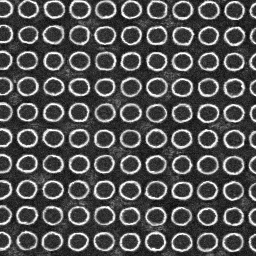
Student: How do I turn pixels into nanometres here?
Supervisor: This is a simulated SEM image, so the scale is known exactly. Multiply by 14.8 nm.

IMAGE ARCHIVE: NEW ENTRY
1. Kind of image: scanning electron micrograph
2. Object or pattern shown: a regular array of raised bodies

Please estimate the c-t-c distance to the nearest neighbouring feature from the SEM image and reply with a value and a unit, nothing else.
0.376 µm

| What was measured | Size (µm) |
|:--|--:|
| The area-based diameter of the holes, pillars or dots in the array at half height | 0.275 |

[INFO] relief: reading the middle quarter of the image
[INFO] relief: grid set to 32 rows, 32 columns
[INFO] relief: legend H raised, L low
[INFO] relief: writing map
LLHHHHLLHHHHLLLHHHHLLHHHHLLLHHHH
LLLLLLLLLLLLLLLLLLLLLLLLLLLLLLLL
LLLLLLLLLLLLLLLLLLLLLLLLLLLLLLLL
LLLLLLLLLLLLLLLLLLLLLLLLLLLLLLLL
LLHHHHLLHHHHLLLHHHHLLHHHHLLLHHHL
LHHHHHLLHHHHLLLHHHHLLHHHHHLHHHHH
LLHHHHLLHHHHLLLHHHHLLHHHHLLHHHHH
LLLHHHLLLHHLLLLHHHLLLLHHLLLLHHHL
LLLLLLLLLLLLLLLLLLLLLLLLLLLLLLLL
LLLLLLLLLLLLLLLLLLLLLLLLLLLLLLLL
LLHHHLLLLHHHLLLLHHLLLLHHLLLLHHHL
LLHHHHLLHHHHHLHHHHHLLHHHHLLHHHHH
LLHHHHLLHHHHHLHHHHHLLHHHHHLHHHHH
LLHHHHLLLHHHLLLHHHHLLHHHHLLLHHHH
LLLLLLLLLLLLLLLLLLLLLLLLLLLLLLLL
LLLLLLLLLLLLLLLLLLLLLLLLLLLLLLLL
LLLLHLLLLLLLLLLLLLLLLLLLLLLLLLLL
LLHHHHLLHHHHLLLHHHHLLHHHHLLHHHHH
LLHHHHLLHHHHLLHHHHHLLHHHHLLHHHHH
LLHHHHLLHHHHLLHHHHHLLHHHHLLHHHHH
LLHHLLLLHHHHLLLLHHLLLLHHLLLLHHLL
LLLLLLLLLLLLLLLLLLLLLLLLLLLLLLLL
LLLLLLLLLLLLLLLLLLLLLLLLLLLLLLLL
LLHHHHLLHHHHLLLHHHLLLLHHLLLLHHHL
LLHHHHLLHHHHLLHHHHHLLHHHHLLHHHHH
LHHHHHLLHHHHLLHHHHHLLHHHHLLHHHHH
LLHHHHLLHHHHLLLHHHLLLHHHHLLLHHHL
LLLLLLLLLLLLLLLLLLLLLLLLLLLLLLLL
LLLLLLLLLLLLLLLLLLLLLLLLLLLLLLLL
LLHHHLLLLHHLLLLLLLLLLLLLLLLLLLLL
LHHHHHLLHHHHLLHHHHHLLHHHHLLLHHHH
LHHHHHLLHHHHLLHHHHHLLHHHHLLHHHHH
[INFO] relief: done